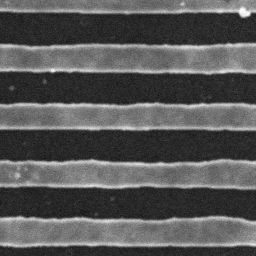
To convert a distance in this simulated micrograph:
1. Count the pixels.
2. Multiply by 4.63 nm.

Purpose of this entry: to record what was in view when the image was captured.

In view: lines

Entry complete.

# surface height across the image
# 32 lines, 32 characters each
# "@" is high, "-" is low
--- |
@@@@@@@@@@@@@@@@@@@@@@@@@@@@@@@@
----------@@@@@@@@@@@@@-@--@-@@@
--------------------------------
--------------------------------
--------------------------------
-----------------------------@@@
@@@@@@@@@@@@@@@@@@@@@@@@@@@@@@@@
@@@@@@@@@@@@@@@@@@@@@@@@@@@@@@@@
@@@@@@@@@@@@@@@@@@@@@@@@@@@@@@@@
--------------------------------
--------------------------------
--------------------------------
--------------------------------
@@@@@@@@@@@@@@@@@@@@@@@@@@@@@@@@
@@@@@@@@@@@@@@@@@@@@@@@@@@@@@@@@
@@@@@@@@@@@@@@@@@@@@@@@@@@@@@@@@
--------------------------------
--------------------------------
--------------------------------
--------------------------------
@@@@@@@@@@@@@@@@@@@@@@@@@@@@@@@@
@@@@@@@@@@@@@@@@@@@@@@@@@@@@@@@@
@@@@@@@@@@@@@@@@@@@@@@@@@@@@@@@@
-----------------------------@@@
--------------------------------
--------------------------------
--------------------------------
@@@@@@@@@@@@@@@@@@--@@@@@@@@@@@-
@@@@@@@@@@@@@@@@@@@@@@@@@@@@@@@@
@@@@@@@@@@@@@@@@@@@@@@@@@@@@@@@@
@@@@@@@@@@@@@@@@@@@@@@@@@@@@@@@@
--------------------------------